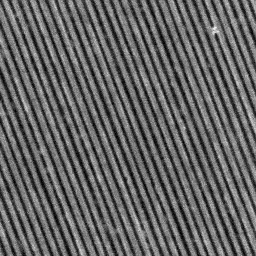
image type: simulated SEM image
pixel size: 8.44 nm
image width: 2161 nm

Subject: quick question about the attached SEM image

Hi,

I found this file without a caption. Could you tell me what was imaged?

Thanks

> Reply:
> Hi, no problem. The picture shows parallel lines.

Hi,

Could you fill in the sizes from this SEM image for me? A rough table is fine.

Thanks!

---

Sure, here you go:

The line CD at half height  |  33.5 nanometres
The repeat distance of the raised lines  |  72.5 nm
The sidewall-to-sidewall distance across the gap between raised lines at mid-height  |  40.9 nanometers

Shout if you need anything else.